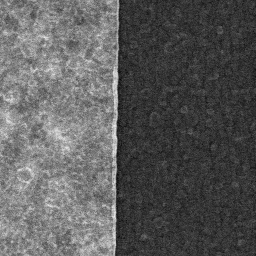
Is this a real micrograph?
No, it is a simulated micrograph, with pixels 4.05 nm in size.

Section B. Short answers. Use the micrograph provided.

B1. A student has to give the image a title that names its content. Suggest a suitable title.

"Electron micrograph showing one or a few lines or trenches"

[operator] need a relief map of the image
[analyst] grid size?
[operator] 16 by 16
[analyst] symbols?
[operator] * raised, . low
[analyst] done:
*******.........
*******.........
*******.........
*******.........
*******.........
*******.........
*******.........
*******.........
*******.........
*******.........
*******.........
*******.........
*******.........
*******.........
*******.........
*******.........